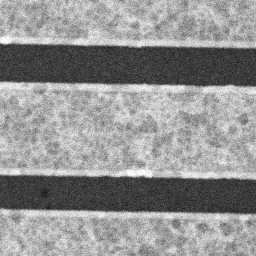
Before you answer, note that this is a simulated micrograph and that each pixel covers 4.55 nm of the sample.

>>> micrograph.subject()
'one or a few lines or trenches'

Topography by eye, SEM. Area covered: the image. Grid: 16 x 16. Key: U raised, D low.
UUUUUUUUUUUUUUUU
UUUUUUUUUUUUUUUU
UUUUUUUUUUUUUUUU
DDDDDDDDDDDDDDDD
DDDDDDDDDDDDDDDD
UUUUUUUDUUDDDDDD
UUUUUUUUUUUUUUUU
UUUUUUUUUUUUUUUU
UUUUUUUUUUUUUUUU
UUUUUUUUUUUUUUUU
UUUUUUUUUUUUUUUU
DDDDDDDDDDDDDDDD
DDDDDDDDDDDDDDDD
UUUUUUUUUUUUDDDD
UUUUUUUUUUUUUUUU
UUUUUUUUUUUUUUUU